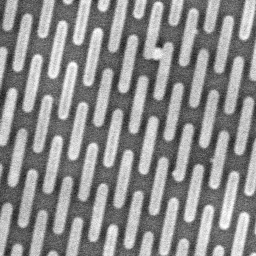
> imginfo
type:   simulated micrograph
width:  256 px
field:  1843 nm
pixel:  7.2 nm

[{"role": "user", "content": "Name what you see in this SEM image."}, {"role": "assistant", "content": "groups of lines, slits or small figures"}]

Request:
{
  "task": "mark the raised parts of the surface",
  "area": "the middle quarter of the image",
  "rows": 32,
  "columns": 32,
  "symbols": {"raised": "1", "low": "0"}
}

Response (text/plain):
01100011000000011000000011000000
01100011001100011000000011000000
01100110001100111000000011000000
01100110001100110001100111000000
11000110011100110001100110000000
11000000011100110011100110001100
11000000011000110011000110011100
11000000011000000011000110011000
11000000011000000011000110011001
10000000111000000011000000011001
10001100110000000111000000011000
10001100110000000110000000111000
10011000110011100110000000110000
00011000110011000110001000110000
00011000110011001110011000110000
00011000000011001110011001110011
00111000000011001100011001110011
00110000000111000000011001110011
00110000000110000000111001100111
00110000000110000000110000000111
00110001000110000000110000000110
01100011000110000000110000000110
01100011001110011000110000000110
00100011001100011001110000001110
00000111001100011001110011001110
00000110000000110001100011001100
00000110000000110001100111001100
00000110000000110000000110011100
11001110000000110000000110001100
11001110000001110000000110000000
11001110010001110000001110000000
11001100011001100000001110000001